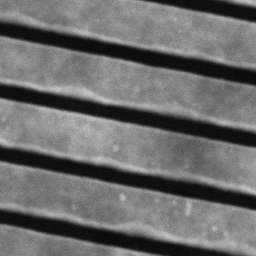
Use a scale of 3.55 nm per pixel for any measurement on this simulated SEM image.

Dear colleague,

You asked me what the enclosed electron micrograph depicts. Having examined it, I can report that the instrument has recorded lines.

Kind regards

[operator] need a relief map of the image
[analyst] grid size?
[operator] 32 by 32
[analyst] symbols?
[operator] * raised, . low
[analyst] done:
********************..........**
*************************.......
******************************..
.....***************************
..........**********************
*****..........*****************
**********..........************
***************..........*******
********************..........**
*************************.......
.******************************.
......**************************
*..........*********************
******..........****************
***********...........**********
****************...........*****
**********************..........
***************************.....
..******************************
......**************************
*...........********************
*******.........****************
************...........*********
*****************...........****
**********************..........
****************************....
..******************************
........************************
***.........********************
********..........**************
************...........*********
*****************............***